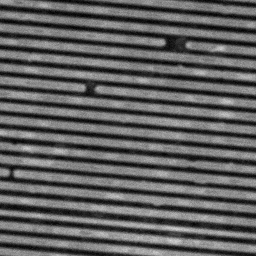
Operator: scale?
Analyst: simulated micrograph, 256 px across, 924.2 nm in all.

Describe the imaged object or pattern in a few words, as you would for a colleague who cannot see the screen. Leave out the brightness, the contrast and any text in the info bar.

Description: parallel lines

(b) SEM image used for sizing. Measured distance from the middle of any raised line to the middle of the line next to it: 47.3 nm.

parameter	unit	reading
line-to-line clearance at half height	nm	18.9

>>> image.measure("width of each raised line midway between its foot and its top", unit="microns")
0.0278